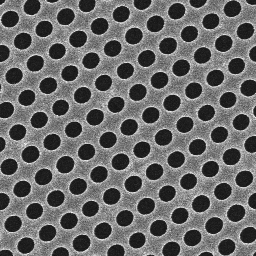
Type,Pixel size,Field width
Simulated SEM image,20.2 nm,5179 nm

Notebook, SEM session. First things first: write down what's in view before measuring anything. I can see a regular array of holes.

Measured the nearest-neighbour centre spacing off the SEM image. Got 499 nm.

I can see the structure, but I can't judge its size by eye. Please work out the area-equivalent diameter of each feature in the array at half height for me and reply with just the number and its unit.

347 nanometers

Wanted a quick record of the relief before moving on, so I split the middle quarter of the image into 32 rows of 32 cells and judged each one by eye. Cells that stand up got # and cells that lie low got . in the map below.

#..##...######...##..######.....
....#########....##########....#
....#########....######...#....#
...#####....##..######....######
########....##########....######
########....#####...##...######.
###...###..#####.....#########..
###....#########.....#########..
##.....#####..###...#####....##.
.##...#####....##########....###
.##########....##########....###
.######..##...######....##..####
######....##########....########
######....##########....#####...
##..##...######...##...#####....
#...###.######.....#########....
....##########....######..##....
....######...##..######....#####
#########....##########....#####
#########....######.###....#####
####...##...######....#########.
####....#########.....#########.
###.....#####..###...######...##
..##...#####....##########....##
...#########....##########....##
..##########....#####...###..###
..#####....##..######....#######
######.....#########.....######.
#######....#####...##...#####...
##...###..#####.....#########...
#.....#########....######..##...
#....######..###...#####....####